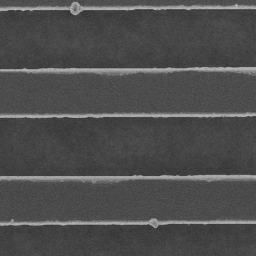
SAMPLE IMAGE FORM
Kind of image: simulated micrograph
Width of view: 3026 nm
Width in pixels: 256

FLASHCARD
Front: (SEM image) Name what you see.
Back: lines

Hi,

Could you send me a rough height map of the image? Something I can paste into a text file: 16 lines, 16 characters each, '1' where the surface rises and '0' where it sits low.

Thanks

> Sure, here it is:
1111111111111111
0000000000000000
0000000000000000
0000000000000000
1111111111111111
1111111111111111
1111111111111111
0000000000000000
0000000000000000
0000000000000000
0000000000000000
1111111111111111
1111111111111111
1111111111111111
0000000000000000
0000000000000000